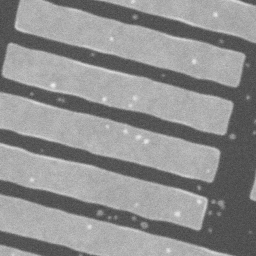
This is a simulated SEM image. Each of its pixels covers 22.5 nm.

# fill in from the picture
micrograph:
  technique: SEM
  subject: groups of lines, slits or small figures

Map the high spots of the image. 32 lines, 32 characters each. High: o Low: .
..oooo.........oooooooooooooooo.
..oooooooo........oooooooooooooo
..oooooooooooo.........ooooooooo
..oooooooooooooooo.......ooooooo
.....oooooooooooooooo.........oo
.o.......ooooooooooooooooo......
.oooo........oooooooooooooooo...
.oooooooo........ooooooooooooo..
oooooooooooo........oooooooooo..
.oooooooooooooooo.......oooooo..
...ooooooooooooooooo........oo..
........oooooooooooooooo........
oooo.......ooooooooooooooooo....
ooooooo........oooooooooooooo...
oooooooooooo.......oooooooooo...
ooooooooooooooo........ooooo....
..ooooooooooooooooo.......oo....
......ooooooooooooooooo.........
oo........oooooooooooooooo......
ooooo........oooooooooooooo.....
oooooooooo........ooooooooo.....
oooooooooooooo.......oooooo.....
.ooooooooooooooooo.......o......
....ooooooooooooooooo...........
o........oooooooooooooooo......o
oooo........oooooooooooooo......
oooooooo........oooooooooo......
oooooooooooo........ooooo.......
oooooooooooooooo........o.......
...oooooooooooooooo.............
.......ooooooooooooooooo........
ooo........oooooooooooooooo.....